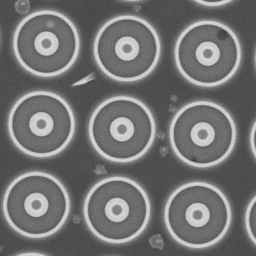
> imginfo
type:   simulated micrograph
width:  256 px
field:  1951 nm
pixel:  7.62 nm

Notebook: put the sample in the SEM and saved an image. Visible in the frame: an array of small figures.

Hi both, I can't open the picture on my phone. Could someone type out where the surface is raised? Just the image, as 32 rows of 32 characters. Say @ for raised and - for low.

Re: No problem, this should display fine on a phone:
@@@@@@@@@@@@@@@@@@@@@@@@@@@@@@@@
@@@@@@@@@@@@@@@@@@@@@@@@@@@@@@@@
@@@-----@@@@@@---@@@@@@@@@@@@@@@
@@@------@@@@------@@@@@----@@@@
@@---@---@@@-------@@@@------@@@
@@---@@---@@---@@---@@--------@@
@@---@---@@@---@@---@@---@@---@@
@@@------@@@-------@@@---@@---@@
@@@@----@@@@@------@@@@------@@@
@@@@@@@@@@@@@@----@@@@@------@@@
@@@@@@@@@@@@@@@@@@@@@@@@@--@@@@@
@@@@@@@@@@@@@@@@@@@@@@@@@@@@@@@@
@@@----@@@@@@@--@@@@@@@@@@@@@@@@
@@------@@@@@-----@@@@@----@@@@@
@----@---@@@-------@@@------@@@@
@---@@---@@---@@---@@@-------@@@
@----@---@@---@@---@@@--@@---@@@
@@------@@@@-------@@@--@@---@@@
@@@-----@@@@------@@@@-------@@@
@@@@@@@@@@@@@----@@@@@@-----@@@@
@@@@@@@@@@@@@@@@@@@@@@@@--@@@@@@
@@@@@@@@@@@@@@@@@@@@@@@@@@@@@@@@
@@-----@@@@@@@--@@@@@@@@@@@@@@@@
@-------@@@@-----@@@@@@---@@@@@@
@---@---@@@-------@@@@------@@@@
@--@@@--@@@---@@--@@@-------@@@-
@---@---@@@--@@@--@@@---@@---@@-
@-------@@@-------@@@---@@--@@@-
@@-----@@@@@------@@@-------@@@-
@@@@@@@@@@@@@----@@@@@------@@@@
@@@@@@@@@@@@@@@@@@@@@@@---@@@@@@
@@@@@@@@@@@@@@@@@@@@@@@@@@@@@@@@